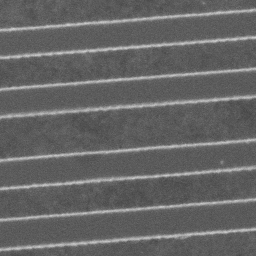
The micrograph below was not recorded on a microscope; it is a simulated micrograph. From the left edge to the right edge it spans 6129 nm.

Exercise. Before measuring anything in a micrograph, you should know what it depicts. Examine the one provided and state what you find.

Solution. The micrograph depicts lines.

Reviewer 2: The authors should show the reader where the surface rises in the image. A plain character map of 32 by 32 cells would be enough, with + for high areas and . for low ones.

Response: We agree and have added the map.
................................
.............................+++
.................+++++++++++++++
...+++++++++++++++++++++++++++++
++++++++++++++++++++++++++++++++
+++++++++++++++++++++++.........
+++++++++.......................
................................
................................
....................++++++++++++
........++++++++++++++++++++++++
++++++++++++++++++++++++++++++++
+++++++++++++++++++++++++++.....
++++++++++++++..................
++..............................
................................
................................
...............................+
..................++++++++++++++
......++++++++++++++++++++++++++
++++++++++++++++++++++++++++++++
++++++++++++++++++++++++++......
+++++++++++++...................
++..............................
................................
........................++++++++
............++++++++++++++++++++
++++++++++++++++++++++++++++++++
++++++++++++++++++++++++++++++++
+++++++++++++++++++++...........
+++++++++.......................
................................